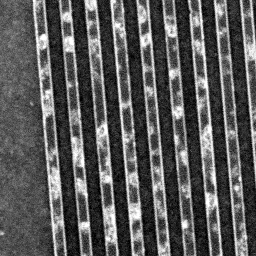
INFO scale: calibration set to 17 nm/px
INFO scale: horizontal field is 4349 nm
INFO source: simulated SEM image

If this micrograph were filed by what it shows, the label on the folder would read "parallel lines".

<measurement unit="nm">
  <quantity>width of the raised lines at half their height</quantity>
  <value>184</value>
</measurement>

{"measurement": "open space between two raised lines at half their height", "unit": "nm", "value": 256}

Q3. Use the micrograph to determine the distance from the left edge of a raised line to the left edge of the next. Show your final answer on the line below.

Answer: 438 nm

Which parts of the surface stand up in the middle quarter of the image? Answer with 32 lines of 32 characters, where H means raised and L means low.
HHHLLLLHHLLLLHHHLLLLHHLLLLHHHLLL
LHHLLLLHHLLLLHHHLLLLHHLLLLHHHLLL
LHHLLLLHHHLLLHHHLLLLHHHLLLHHHLLL
LHHLLLLHHHLLLLHHLLLLHHHLLLHHHLLL
LHHLLLLHHHLLLLHHLLLLHHHLLLLHHLLL
LHHLLLLHHHLLLLHHLLLLHHHLLLLHHLLL
LHHLLLLHHHLLLLHHLLLLHHHLLLLHHLLL
LHHLLLLHHHLLLLHHLLLLHHHLLLLHHLLL
LHHHLLLHHHLLLLHHHLLLLHHLLLLHHLLL
LHHHLLLLHHLLLLHHHLLLLHHLLLLHHLLL
LHHHLLLLHHLLLLHHHLLLLHHLLLLHHHLL
LHHHLLLLHHLLLLHHHLLLLHHLLLLHHHLL
LLHHLLLLHHLLLLHHHLLLLHHLLLLHHHLL
LLHHLLLLHHLLLLHHHLLLLHHHLLLHHHLL
LLHHLLLLHHHLLLLHHLLLLHHLLLLHHHLL
LLHHLLLLHHHLLLLHHLLLLHHHLLLHHHLL
LLHHLLLLHHHLLLLHHLLLLHHHLLLLHHLL
LLHHLLLLHHHLLLLHHLLLLHHHLLLLHHLL
LLHHLLLLHHHLLLLHHLLLLHHHLLLLHHLL
LLHHLLLLHHHLLLLHHHLLLHHHLLLLHHLL
LLHHHLLLLHHLLLLHHHLLLLHHLLLLHHLL
LLHHHLLLLHHLLLLHHHLLLLHHLLLLHHHL
LLHHHLLLLHHLLLLHHHLLLLHHLLLLHHHL
LLHHHLLLLHHLLLLHHHLLLLHHLLLLHHHL
LLLHHLLLLHHLLLLHHHLLLLHHLLLLHHHL
LLLHHLLLLHHLLLLHHHLLLLHHLLLLHHHL
LLLHHLLLLHHHLLLLHHLLLLHHLLLLHHHL
LLLHHLLLLHHHLLLLHHLLLLHHHLLLHHHL
LLLHHLLLLHHHLLLLHHLLLLHHHLLLLHHL
LLLHHLLLLHHHLLLLHHLLLLHHHLLLLHHL
LLLHHLLLLHHHLLLLHHLLLLHHHLLLLHHL
LLLHHLLLLHHHLLLLHHHLLLHHHLLLLHHL